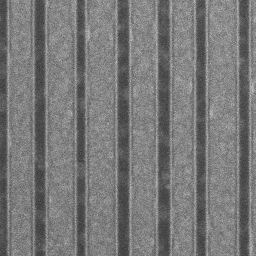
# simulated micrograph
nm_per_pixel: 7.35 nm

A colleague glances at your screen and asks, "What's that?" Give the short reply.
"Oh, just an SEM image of parallel lines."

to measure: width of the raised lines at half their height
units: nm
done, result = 95.5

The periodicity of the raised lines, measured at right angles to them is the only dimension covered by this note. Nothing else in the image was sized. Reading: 0.3 micrometres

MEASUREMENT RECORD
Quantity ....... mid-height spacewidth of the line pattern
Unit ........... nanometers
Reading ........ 190